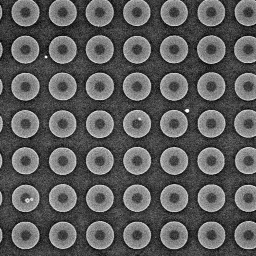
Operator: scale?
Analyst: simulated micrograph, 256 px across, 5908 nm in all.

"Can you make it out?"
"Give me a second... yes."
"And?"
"an array of small figures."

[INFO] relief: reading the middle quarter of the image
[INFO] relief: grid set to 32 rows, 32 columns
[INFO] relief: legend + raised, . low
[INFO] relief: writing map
................................
................................
+.......++.......++.......+++...
++....++++++....+++++....+++++..
+++...++++++...+++++++..+++++++.
+++...++++++...+++++++..+++++++.
+++...++++++...+++++++..+++++++.
+++...++++++...++++++....+++++..
++.....++++.....++++......+++...
................................
................................
................................
++.....++++.....+++++....+++++..
+++...++++++...++++++...++++++..
+++...++++++...+++++++..+++++++.
+++...++++++...+++++++..+++++++.
+++...++++++...++++++....+++++..
++.....++++.....+++++....+++++..
................................
................................
................................
++.....++++.....++++......++++..
+++...++++++...++++++....+++++..
+++...++++++...+++++++..+++++++.
+++...++++++...+++++++..+++++++.
+++...++++++...++++++...+++++++.
++....+++++.....+++++....+++++..
+.......++.......++........++...
................................
................................
+.......++.......+++......+++...
++....++++++....+++++....+++++..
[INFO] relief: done